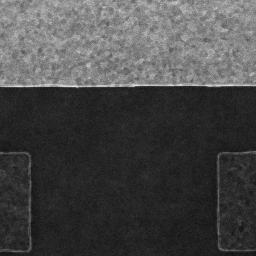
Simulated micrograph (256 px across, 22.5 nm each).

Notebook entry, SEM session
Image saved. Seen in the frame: wiring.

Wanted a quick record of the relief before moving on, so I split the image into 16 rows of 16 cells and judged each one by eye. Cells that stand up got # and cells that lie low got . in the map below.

################
################
################
################
################
................
................
................
................
...............#
##............##
##............##
##............##
##............##
##............##
##............##